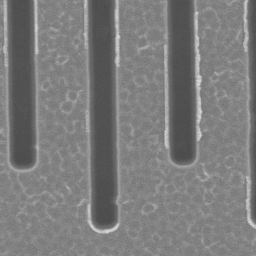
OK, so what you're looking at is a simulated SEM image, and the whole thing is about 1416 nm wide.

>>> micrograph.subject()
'one or a few lines or trenches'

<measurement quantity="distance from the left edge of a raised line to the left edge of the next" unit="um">0.442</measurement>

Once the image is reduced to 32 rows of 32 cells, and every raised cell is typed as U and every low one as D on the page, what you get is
UDDDUUUUUUUDDDUUUUUUUDDDUUUUUUUD
UDDDUUUUUUUDDDUUUUUUUDDDUUUUUUUD
UDDDUUUUUUUDDDUUUUUUUDDDUUUUUUUD
UDDDUUUUUUUDDDUUUUUUUDDDUUUUUUUD
UDDDUUUUUUUDDDUUUUUUUDDDUUUUUUUD
UDDDUUUUUUUDDDUUUUUUUDDDUUUUUUUD
UDDDUUUUUUUDDDUUUUUUUDDDUUUUUUUD
UDDDUUUUUUUDDDUUUUUUUDDDUUUUUUUD
UDDDUUUUUUUDDDUUUUUUUDDDUUUUUUUD
UDDDUUUUUUUDDDUUUUUUUDDDUUUUUUUD
UDDDUUUUUUUDDDUUUUUUUDDDUUUUUUUD
UDDDUUUUUUUDDDUUUUUUUDDDUUUUUUUD
UDDDUUUUUUUDDDUUUUUUUDDDUUUUUUUD
UDDDUUUUUUUDDDUUUUUUUDDDUUUUUUUD
UDDDUUUUUUUDDDUUUUUUUDDDUUUUUUUD
UDDDUUUUUUUDDDUUUUUUUDDDUUUUUUUD
UDDDUUUUUUUDDDDUUUUUUDDDUUUUUUUD
UDDDUUUUUUUDDDUUUUUUUDDDUUUUUUUD
UDDDUUUUUUUDDDUUUUUUUDDDUUUUUUUD
UDDDUUUUUUUDDDDUUUUUUDDDUUUUUUUD
UDDDUUUUUUUDDDDUUUUUUUDDUUUUUUUD
UUUUUUUUUUUDDDDUUUUUUUUUUUUUUUUD
UUUUUUUUUUUDDDDUUUUUUUUUUUUUUUUU
UUUUUUUUUUUDDDDUUUUUUUUUUUUUUUUU
UUUUUUUUUUUDDDDUUUUUUUUUUUUUUUUD
UUUUUUUUUUUDDDUUUUUUUUUUUUUUUUUD
UUUUUUUUUUUDDDDUUUUUUUUUUUUUUUUD
UUUUUUUUUUUUDDDUUUUUUUUUUUUUUUUU
UUUUUUUUUUUUDDUUUUUUUUUUUUUUUUUU
UUUUUUUUUUUUUUUUUUUUUUUUUUUUUUUU
UUUUUUUUUUUUUUUUUUUUUUUUUUUUUUUU
UUUUUUUUUUUUUUUUUUUUUUUUUUUUUUUU